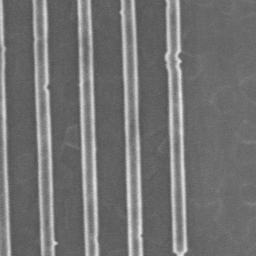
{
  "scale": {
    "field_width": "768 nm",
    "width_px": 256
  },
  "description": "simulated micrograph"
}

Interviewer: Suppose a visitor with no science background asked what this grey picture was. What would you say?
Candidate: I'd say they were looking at parallel lines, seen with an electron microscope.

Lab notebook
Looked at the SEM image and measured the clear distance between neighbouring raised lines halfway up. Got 97.6 nanometres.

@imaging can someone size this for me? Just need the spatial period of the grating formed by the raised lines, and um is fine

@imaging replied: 0.133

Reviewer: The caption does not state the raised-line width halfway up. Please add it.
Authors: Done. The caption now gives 0.0341 µm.